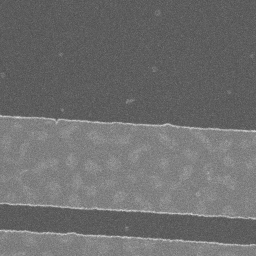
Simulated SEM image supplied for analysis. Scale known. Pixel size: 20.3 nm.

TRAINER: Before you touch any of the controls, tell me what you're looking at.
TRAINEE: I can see one or a few lines or trenches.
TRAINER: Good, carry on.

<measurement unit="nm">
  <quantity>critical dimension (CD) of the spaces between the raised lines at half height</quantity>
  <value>1760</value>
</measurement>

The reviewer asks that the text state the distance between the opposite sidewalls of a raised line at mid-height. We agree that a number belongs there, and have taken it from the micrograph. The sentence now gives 0.551 microns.